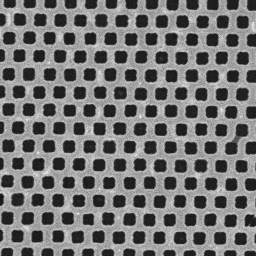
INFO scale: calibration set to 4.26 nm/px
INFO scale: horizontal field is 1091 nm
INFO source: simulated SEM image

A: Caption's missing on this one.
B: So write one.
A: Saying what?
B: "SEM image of a regular array of holes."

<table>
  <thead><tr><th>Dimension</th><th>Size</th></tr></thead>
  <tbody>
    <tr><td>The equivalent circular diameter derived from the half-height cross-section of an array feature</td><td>56.6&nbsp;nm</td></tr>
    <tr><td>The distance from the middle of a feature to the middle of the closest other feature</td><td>85.2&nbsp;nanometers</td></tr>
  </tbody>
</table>